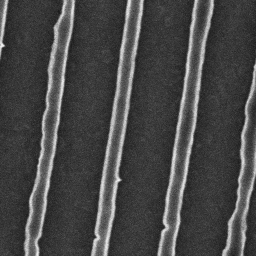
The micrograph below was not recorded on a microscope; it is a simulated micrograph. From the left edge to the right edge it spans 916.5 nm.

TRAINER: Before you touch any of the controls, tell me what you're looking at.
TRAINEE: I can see one or a few lines or trenches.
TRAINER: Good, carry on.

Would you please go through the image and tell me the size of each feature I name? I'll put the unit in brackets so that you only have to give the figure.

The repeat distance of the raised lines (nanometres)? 240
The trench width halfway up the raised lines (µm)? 0.19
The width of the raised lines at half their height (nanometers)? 48.3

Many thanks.